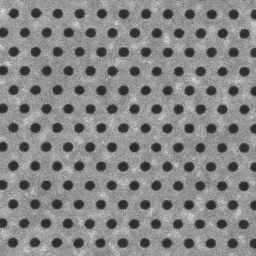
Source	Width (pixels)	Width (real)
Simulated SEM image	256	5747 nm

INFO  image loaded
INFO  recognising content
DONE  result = a regular array of holes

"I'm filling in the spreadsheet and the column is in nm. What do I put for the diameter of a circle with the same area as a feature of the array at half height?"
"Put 240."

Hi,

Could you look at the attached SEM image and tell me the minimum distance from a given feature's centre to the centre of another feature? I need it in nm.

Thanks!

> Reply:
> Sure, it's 488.